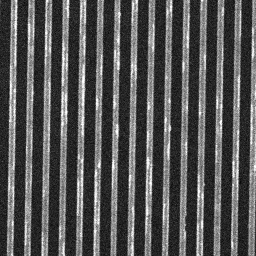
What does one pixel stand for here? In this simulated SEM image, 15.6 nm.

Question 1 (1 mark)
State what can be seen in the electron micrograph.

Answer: parallel lines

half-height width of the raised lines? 6 px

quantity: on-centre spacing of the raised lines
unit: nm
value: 268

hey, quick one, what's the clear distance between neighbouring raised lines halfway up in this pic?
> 175 nm